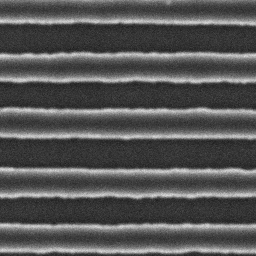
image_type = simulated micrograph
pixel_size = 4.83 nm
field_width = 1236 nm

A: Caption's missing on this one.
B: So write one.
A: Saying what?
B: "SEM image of lines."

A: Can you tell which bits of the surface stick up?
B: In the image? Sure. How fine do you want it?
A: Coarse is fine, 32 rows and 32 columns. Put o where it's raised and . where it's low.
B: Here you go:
oooooooooooooooooooooooooooooooo
oooooooooooooooooooooooooooooooo
oooooooooooooooooooooooooooooooo
................................
................................
................................
................................
oooooooooooooooooooooooooooooooo
oooooooooooooooooooooooooooooooo
oooooooooooooooooooooooooooooooo
................................
................................
................................
................................
oooooooooooooooooooooooooooooooo
oooooooooooooooooooooooooooooooo
oooooooooooooooooooooooooooooooo
................................
................................
................................
................................
oooooooooooooooooooooooooooooooo
oooooooooooooooooooooooooooooooo
oooooooooooooooooooooooooooooooo
ooooooooooooo.oooooooooooo.oooo.
................................
................................
................................
oooooooooooooooooooooooooooooooo
oooooooooooooooooooooooooooooooo
oooooooooooooooooooooooooooooooo
....oo...o..ooooooo.ooo....ooooo